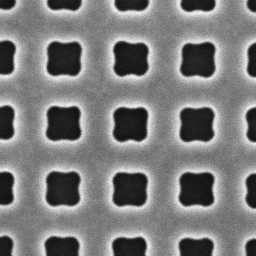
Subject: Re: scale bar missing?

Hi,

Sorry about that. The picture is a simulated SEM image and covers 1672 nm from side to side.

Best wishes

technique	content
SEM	a regular array of holes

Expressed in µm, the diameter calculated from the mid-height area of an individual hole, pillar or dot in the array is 0.249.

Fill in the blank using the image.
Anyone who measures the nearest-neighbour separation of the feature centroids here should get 424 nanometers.